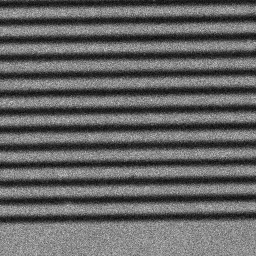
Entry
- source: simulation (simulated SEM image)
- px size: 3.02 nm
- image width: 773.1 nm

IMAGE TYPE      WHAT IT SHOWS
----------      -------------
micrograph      parallel lines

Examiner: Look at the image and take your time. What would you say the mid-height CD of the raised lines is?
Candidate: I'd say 30.9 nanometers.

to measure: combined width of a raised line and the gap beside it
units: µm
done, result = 0.054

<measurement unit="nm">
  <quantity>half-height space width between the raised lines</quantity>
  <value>23.4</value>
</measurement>